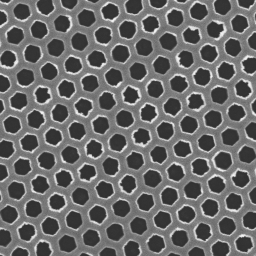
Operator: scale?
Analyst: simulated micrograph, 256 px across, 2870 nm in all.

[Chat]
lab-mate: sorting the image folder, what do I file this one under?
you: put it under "a regular array of holes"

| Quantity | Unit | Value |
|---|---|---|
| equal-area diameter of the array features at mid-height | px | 16.5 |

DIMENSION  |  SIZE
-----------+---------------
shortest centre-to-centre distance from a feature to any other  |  271 nm